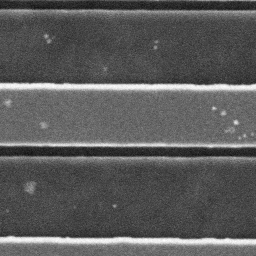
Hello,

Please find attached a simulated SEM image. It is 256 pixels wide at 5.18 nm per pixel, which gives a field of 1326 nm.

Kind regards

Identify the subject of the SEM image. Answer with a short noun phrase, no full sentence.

lines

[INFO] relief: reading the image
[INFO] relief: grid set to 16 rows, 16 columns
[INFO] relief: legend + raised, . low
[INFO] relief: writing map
................
................
................
................
................
++++++++++++++++
++++++++++++++++
++++++++++++++++
++++++++++++++++
................
................
................
................
................
................
++++++++++++++++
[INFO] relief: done